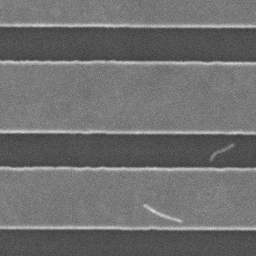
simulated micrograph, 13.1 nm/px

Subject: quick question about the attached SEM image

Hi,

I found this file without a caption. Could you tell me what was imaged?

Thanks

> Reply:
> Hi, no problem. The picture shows lines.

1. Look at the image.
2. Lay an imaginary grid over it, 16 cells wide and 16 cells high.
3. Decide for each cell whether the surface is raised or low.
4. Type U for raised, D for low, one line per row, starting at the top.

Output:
UUUUUUUUUUUUUUUU
UUUUUUUUUUUUUUUU
DDDDDDDDDDDDDDDD
DDDDDDDDDDDDDDDD
UUUUUUUUUUUUUUUU
UUUUUUUUUUUUUUUU
UUUUUUUUUUUUUUUU
UUUUUUUUUUUUUUUU
DDDDDDDDDDDDDDDD
DDDDDDDDDDDDDDDD
UUUUUUUDDDDDDDDD
UUUUUUUUUUUUUUUU
UUUUUUUUUUUUUUUU
UUUUUUUUUUUUUUUU
DDDDDDDDDDDDDDDD
DDDDDDDDDDDDDDDD